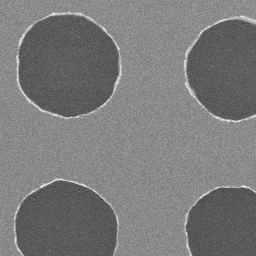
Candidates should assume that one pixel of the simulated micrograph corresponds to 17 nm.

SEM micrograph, holes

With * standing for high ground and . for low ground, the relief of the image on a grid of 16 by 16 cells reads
****************
**....********..
*......*****....
*......*****....
*......*****....
*......*****....
**....*******...
**************.*
****************
****************
****************
***..***********
**....******....
*......*****....
*......*****....
*......*****....